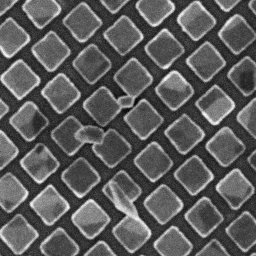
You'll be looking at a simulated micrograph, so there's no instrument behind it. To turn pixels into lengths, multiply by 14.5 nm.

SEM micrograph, a regular array of raised bodies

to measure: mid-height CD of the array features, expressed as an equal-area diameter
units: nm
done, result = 488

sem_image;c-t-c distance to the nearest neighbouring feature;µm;0.613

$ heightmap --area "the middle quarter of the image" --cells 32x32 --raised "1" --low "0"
00011111111100011111000011000001
00011111111000111111100000000000
00001111110001111111100000111000
10000111100001111111110001111100
11000011000001111111110011111110
11000000000000111111100111111111
11100000111000011111000111111111
11110001111100001110000111111111
11100011111110111100000011111110
11000111111111111001100001111100
11000111111111111011110000111000
00000111111111000111111000000000
00000011111110001111111100000000
01000001111100011111111110000110
11110000111000001111111110001111
11111010010000001111111100011111
11111111110110000111111000111111
11111111111111000011100001111111
11111111111111100001100000111111
11111111111111110000000000011111
11110001111111110000011100001111
11100001111111111000111110001110
01000000111111110001111110000000
00000000011111100011111111000000
00011100001111000011111111100011
00111110000110000011111111100111
01111111000000000001111111001111
11111111000001110000111110001111
11111111100011111000011100001111
11111111100111111000000000000111
01111110001111111100000011000011
00111110001111111110000111100001